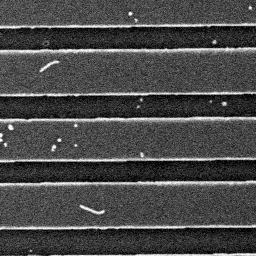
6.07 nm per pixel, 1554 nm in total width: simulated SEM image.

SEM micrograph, lines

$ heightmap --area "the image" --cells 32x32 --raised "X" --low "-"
XXXXXXXXXXXXXXXXXXXXXXXXXXXXXXXX
XXXXXXXXXXXXXXXXXXXXXXXXXXXXXXXX
XXXXXXXXXXXXXXXXXXXXXXXXXXXXXXXX
--------------------------------
--------------------------------
--------------------------------
XXXXXXXXXXXXXXXXXXXXXXXXXXXXXXXX
XXXXXXXXXXXXXXXXXXXXXXXXXXXXXXXX
XXXXXXXXXXXXXXXXXXXXXXXXXXXXXXXX
XXXXXXXXXXXXXXXXXXXXXXXXXXXXXXXX
XXXXXXXXXXXXXXXXXXXXXXXXXXXXXXXX
XXXXXXXXXXXXXXXXXXXXXXXXXXXXXXXX
--------------------------------
--------------------------------
--------------------------------
XXXXXXXXXXXXXXXXXXXXXXXXXXXXXXXX
XXXXXXXXXXXXXXXXXXXXXXXXXXXXXXXX
XXXXXXXXXXXXXXXXXXXXXXXXXXXXXXXX
XXXXXXXXXXXXXXXXXXXXXXXXXXXXXXXX
XXXXXXXXXXXXXXXXXXXXXXXXXXXXXXXX
--------------------------------
--------------------------------
--------------------------------
XXXXXXXXXXXXXXXXXXXXXXXXXXXXXXXX
XXXXXXXXXXXXXXXXXXXXXXXXXXXXXXXX
XXXXXXXXXXXXXXXXXXXXXXXXXXXXXXXX
XXXXXXXXXXXXXXXXXXXXXXXXXXXXXXXX
XXXXXXXXXXXXXXXXXXXXXXXXXXXXXXXX
XXXXXXXXXXX---------------------
--------------------------------
--------------------------------
--------------------------------